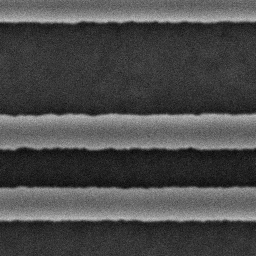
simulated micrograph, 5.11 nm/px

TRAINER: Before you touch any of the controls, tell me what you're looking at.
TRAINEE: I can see lines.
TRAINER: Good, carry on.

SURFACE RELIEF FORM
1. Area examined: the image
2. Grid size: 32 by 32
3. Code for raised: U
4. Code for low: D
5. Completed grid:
UUUUUUUUUUUUUUUUUUUUUUUUUUUUUUUU
UUUUUUUUUUUUUUUUUUUUUUUUUUUUUUUU
UUUUUUUUUUUUUUUUUUUUUUUUUUUUUUUU
DDDDDDDDDDDDDDDDDDDDDDDDDDDDDDDD
DDDDDDDDDDDDDDDDDDDDDDDDDDDDDDDD
DDDDDDDDDDDDDDDDDDDDDDDDDDDDDDDD
DDDDDDDDDDDDDDDDDDDDDDDDDDDDDDDD
DDDDDDDDDDDDDDDDDDDDDDDDDDDDDDDD
DDDDDDDDDDDDDDDDDDDDDDDDDDDDDDDD
DDDDDDDDDDDDDDDDDDDDDDDDDDDDDDDD
DDDDDDDDDDDDDDDDDDDDDDDDDDDDDDDD
DDDDDDDDDDDDDDDDDDDDDDDDDDDDDDDD
DDDDDDDDDDDDDDDDDDDDDDDDDDDDDDDD
DDDDDDDDDDDDDDDDDDDDDDDDDDDDDDDD
UDDDDUUUUUUDUUUUUUDUUUUUUUUUUUUU
UUUUUUUUUUUUUUUUUUUUUUUUUUUUUUUU
UUUUUUUUUUUUUUUUUUUUUUUUUUUUUUUU
UUUUUUUUUUUUUUUUUUUUUUUUUUUUUUUU
UUDDUUDDDDDUUUUUDUUDUUDDUUUUUUUU
DDDDDDDDDDDDDDDDDDDDDDDDDDDDDDDD
DDDDDDDDDDDDDDDDDDDDDDDDDDDDDDDD
DDDDDDDDDDDDDDDDDDDDDDDDDDDDDDDD
DDDDDDDDDDDDDDDDDDDDDDDDDDDDDDDD
DDUUUUUUDDDUDDDDDDDDDUUUUDDUDUUU
UUUUUUUUUUUUUUUUUUUUUUUUUUUUUUUU
UUUUUUUUUUUUUUUUUUUUUUUUUUUUUUUU
UUUUUUUUUUUUUUUUUUUUUUUUUUUUUUUU
UUUUUUUUUUUUUDUUDUUUUUUUUUUUUUUU
DDDDDDDDDDDDDDDDDDDDDDDDDDDDDDDD
DDDDDDDDDDDDDDDDDDDDDDDDDDDDDDDD
DDDDDDDDDDDDDDDDDDDDDDDDDDDDDDDD
DDDDDDDDDDDDDDDDDDDDDDDDDDDDDDDD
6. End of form